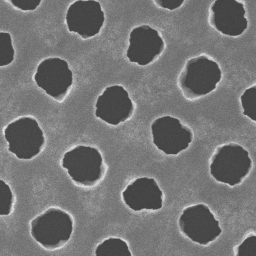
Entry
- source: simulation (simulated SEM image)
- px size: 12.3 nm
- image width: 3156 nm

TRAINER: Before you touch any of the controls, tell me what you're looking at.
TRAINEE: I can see a regular array of holes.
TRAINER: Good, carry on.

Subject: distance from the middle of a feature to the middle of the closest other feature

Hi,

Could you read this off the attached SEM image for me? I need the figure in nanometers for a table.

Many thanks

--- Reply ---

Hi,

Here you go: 798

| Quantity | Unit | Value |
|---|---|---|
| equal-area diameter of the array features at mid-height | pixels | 37.8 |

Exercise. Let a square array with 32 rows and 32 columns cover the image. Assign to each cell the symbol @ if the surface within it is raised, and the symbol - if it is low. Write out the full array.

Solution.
@@---@@@@---@@@@@@@@---@@@@---@@
@@@@@@@@-----@@@@@@@@@@@@@@----@
@@@@@@@@-----@@@@@@@@@@@@@@----@
@@@@@@@@@----@@@@--@@@@@@@@----@
-@@@@@@@@@--@@@@----@@@@@@@@@@@@
-@@@@@@@@@@@@@@@----@@@@@@@@@@@@
--@@@@@@@@@@@@@@----@@@@@@@@@@@@
--@@@@--@@@@@@@@---@@@@@--@@@@@@
@@@@@----@@@@@@@@@@@@@@----@@@@@
@@@@-----@@@@@@@@@@@@@@-----@@@@
@@@@@----@@@@@@@@@@@@@@----@@@@@
@@@@@@--@@@@@---@@@@@@@@--@@@@@-
@@@@@@@@@@@@----@@@@@@@@@@@@@@--
@@@@@@@@@@@@-----@@@@@@@@@@@@@--
@@@@@@@@@@@@----@@@@@@@@@@@@@@@-
@----@@@@@@@@@-@@@@----@@@@@@@@@
@----@@@@@@@@@@@@@@-----@@@@@@@@
@----@@@@@@@@@@@@@@-----@@@@@@@@
@----@@@@---@@@@@@@@---@@@@@--@@
@@--@@@@-----@@@@@@@@@@@@@@----@
@@@@@@@@-----@@@@@@@@@@@@@-----@
@@@@@@@@@----@@@@@@@@@@@@@-----@
@@@@@@@@@---@@@@@--@@@@@@@@---@@
-@@@@@@@@@@@@@@@----@@@@@@@@@@@@
-@@@@@@@@@@@@@@-----@@@@@@@@@@@@
-@@@@@@@@@@@@@@@----@@@@@@@@@@@@
-@@@@@--@@@@@@@@@@@@@@@---@@@@@@
@@@@-----@@@@@@@@@@@@@-----@@@@@
@@@@-----@@@@@@@@@@@@@@----@@@@@
@@@@-----@@@@@@@@@@@@@@----@@@@@
@@@@@--@@@@@@---@@@@@@@@@-@@@@--
@@@@@@@@@@@@----@@@@@@@@@@@@@@--